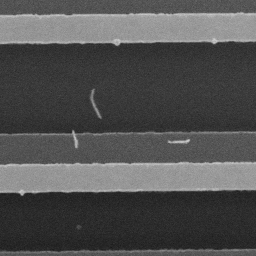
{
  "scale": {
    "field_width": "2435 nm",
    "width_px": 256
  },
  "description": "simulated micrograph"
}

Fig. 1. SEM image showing lines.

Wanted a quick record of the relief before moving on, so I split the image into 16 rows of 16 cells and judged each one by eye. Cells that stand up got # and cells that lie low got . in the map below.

################
################
################
................
................
................
................
................
################
################
################
################
................
................
................
................